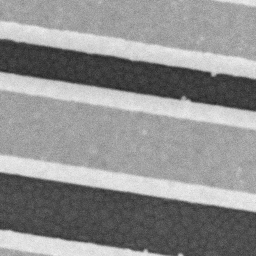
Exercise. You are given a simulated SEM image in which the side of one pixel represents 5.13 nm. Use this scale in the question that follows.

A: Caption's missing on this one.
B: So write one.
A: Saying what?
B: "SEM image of one or a few lines or trenches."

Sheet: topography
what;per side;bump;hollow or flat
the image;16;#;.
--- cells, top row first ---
################
################
...#############
..........######
................
####............
##########......
################
################
################
.###############
.......#########
..............##
................
................
#####...........